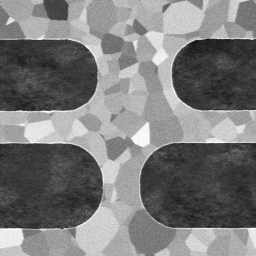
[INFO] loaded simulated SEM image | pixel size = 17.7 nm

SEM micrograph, one or a few lines or trenches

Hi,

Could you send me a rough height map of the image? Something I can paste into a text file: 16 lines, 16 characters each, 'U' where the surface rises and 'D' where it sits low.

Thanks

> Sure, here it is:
UUUUUUUUUUUUUUUU
UUUUUUUUUUUUUUUU
DDDDUUUUUUUUDDDD
DDDDDDUUUUUDDDDD
DDDDDDUUUUUDDDDD
DDDDDDUUUUUDDDDD
DDDDDUUUUUUUDDDD
UUUUUUUUUUUUUUUU
UUUUUUUUUUUUUUUU
DDDDDUUUUUDDDDDD
DDDDDDUUUDDDDDDD
DDDDDDUUUDDDDDDD
DDDDDDUUUDDDDDDD
DDDDDDUUUDDDDDDD
UUUUUUUUUUUUUUUU
UUUUUUUUUUUUUUUU